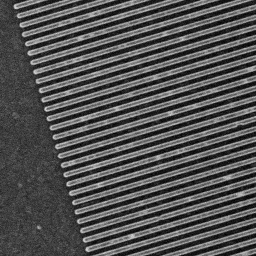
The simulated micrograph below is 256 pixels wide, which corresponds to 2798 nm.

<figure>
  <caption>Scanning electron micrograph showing parallel lines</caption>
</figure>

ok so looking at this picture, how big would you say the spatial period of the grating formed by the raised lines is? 106 nm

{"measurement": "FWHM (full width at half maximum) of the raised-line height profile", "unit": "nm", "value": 43.3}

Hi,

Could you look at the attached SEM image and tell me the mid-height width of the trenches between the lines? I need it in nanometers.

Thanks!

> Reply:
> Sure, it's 65.5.